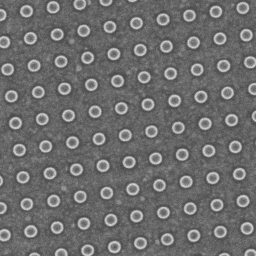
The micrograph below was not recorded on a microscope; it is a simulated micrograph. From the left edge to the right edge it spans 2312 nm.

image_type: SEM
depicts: a regular array of raised bodies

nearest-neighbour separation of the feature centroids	241	nm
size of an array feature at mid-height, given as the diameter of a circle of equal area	101	nanometers